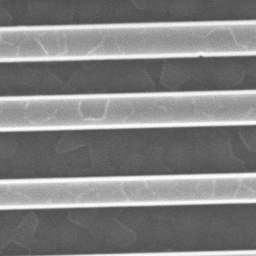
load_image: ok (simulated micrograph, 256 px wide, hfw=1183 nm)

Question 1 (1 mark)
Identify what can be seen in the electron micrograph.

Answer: one or a few lines or trenches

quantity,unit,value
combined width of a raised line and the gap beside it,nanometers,347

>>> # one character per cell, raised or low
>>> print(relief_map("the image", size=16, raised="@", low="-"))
----------------
----------@@@@@@
@@@@@@@@@@@@@@@@
@@@@@@@@@@@-----
----------------
----------------
@@@@@@@@@@@@@@@@
@@@@@@@@@@@@@@@@
----------------
----------------
----------------
@@@@@@@@@@@@@@@@
@@@@@@@@@@@@@@@@
----------------
----------------
----------------